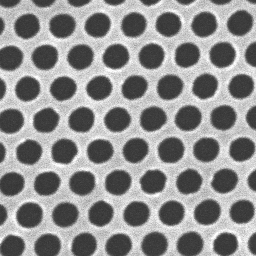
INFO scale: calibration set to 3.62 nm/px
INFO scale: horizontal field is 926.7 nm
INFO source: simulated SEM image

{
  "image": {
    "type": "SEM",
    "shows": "a regular array of holes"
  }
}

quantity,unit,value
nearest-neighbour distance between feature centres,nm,128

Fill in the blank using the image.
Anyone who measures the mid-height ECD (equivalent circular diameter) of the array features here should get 94.8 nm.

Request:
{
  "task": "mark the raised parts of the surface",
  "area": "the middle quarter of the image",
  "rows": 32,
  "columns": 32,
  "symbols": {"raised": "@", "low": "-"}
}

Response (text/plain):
@@----@@@@-----@@@@@----@@@@@---
@@@-@@@@@@@@@@@@@@@@@@@@@@@@@@@@
@@@@@@@@@@@@@@@@@@@@@@@@@@@@@@@@
--@@@@@----@@@@@----@@@@-----@@@
---@@@------@@@------@@@------@@
---@@@------@@-------@@-------@@
---@@-------@@-------@@-------@@
---@@@------@@@-----@@@------@@@
--@@@@@----@@@@----@@@@@----@@@@
@@@@@@@@@@@@@@@@@@@@@@@@@@@@@@@@
@@@@@@@@@@@@@@@@@@@@@@@@@@@@@@--
@@-----@@@@----@@@@@-----@@@@---
@-------@@------@@@-------@@----
@-------@@-------@@-------@@----
@-------@@-------@@-------@@----
@------@@@------@@@------@@@----
@@-----@@@@----@@@@@----@@@@@---
@@@@@@@@@@@@@@@@@@@@@@@@@@@@@@@@
@@@@@@@@@@@@@@@@@@-@@@@@@@--@@@@
--@@@@@-----@@@@-----@@@------@@
---@@@------@@@------@@@------@@
---@@@------@@@------@@-------@@
---@@@------@@@------@@@------@@
---@@@------@@@-----@@@@-----@@@
--@@@@@----@@@@@---@@@@@@---@@@@
@@@@@@@@@@@@@@@@@@@@@@@@@@@@@@@@
@@@@@@@@@@@@@--@@@@@@---@@@@@@--
@@-----@@@@-----@@@@-----@@@@---
@-------@@-------@@-------@@----
@-------@@-------@@-------@@----
@-------@@-------@@------@@@----
@@-----@@@------@@@@-----@@@----